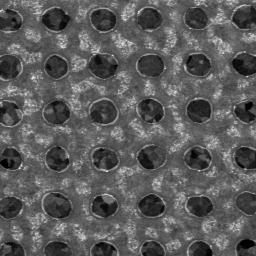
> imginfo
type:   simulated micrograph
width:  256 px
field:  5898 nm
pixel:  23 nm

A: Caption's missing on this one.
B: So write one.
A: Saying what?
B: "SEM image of a regular array of raised bodies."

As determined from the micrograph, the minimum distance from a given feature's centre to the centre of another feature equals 1060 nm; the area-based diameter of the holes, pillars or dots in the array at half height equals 596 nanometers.